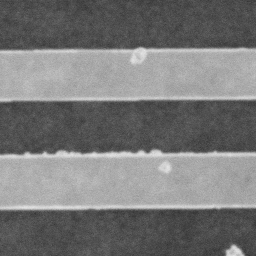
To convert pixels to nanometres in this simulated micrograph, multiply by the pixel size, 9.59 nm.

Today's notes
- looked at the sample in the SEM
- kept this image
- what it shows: lines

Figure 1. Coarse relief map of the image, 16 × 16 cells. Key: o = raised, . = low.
................
................
................
oooooooooooooooo
oooooooooooooooo
oooooooooooooooo
................
................
................
................
oooooooooooooooo
oooooooooooooooo
oooooooooooooooo
................
................
................